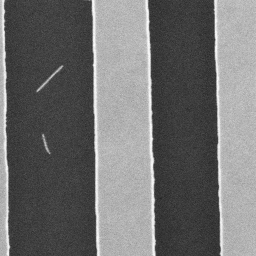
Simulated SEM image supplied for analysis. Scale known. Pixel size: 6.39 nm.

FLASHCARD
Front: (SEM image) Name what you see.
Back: lines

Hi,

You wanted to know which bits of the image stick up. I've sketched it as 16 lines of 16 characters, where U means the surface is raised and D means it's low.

DDDDDDUUUDDDDUUU
DDDDDDUUUDDDDUUU
DDDDDDUUUDDDDUUU
DDDDDDUUUDDDDUUU
DDDDDDUUUDDDDDUU
DDDDDDUUUDDDDDUU
DDDDDDUUUDDDDDUU
DDDDDDUUUDDDDDUU
DDDDDDUUUDDDDDUU
DDDDDDUUUUDDDDUU
DDDDDDUUUUDDDDUU
DDDDDDUUUUDDDDUU
DDDDDDUUUUDDDDUU
DDDDDDUUUUDDDDUU
UDDDDDUUUUDDDDUU
UDDDDDUUUUDDDDUU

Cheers